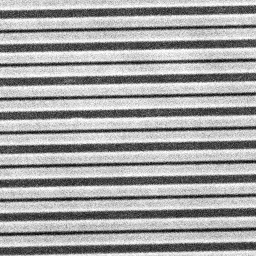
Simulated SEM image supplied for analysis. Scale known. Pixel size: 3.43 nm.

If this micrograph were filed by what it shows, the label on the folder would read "parallel lines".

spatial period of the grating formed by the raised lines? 57.3 nm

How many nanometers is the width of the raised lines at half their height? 36